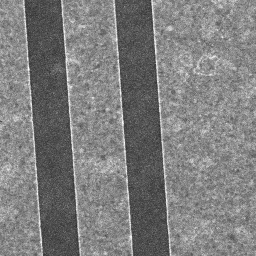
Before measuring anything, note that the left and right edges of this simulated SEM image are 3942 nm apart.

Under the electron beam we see one or a few lines or trenches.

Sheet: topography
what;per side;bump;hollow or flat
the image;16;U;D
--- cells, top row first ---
UUDDUUUDDDUUUUUU
UUDDUUUDDDUUUUUU
UUDDUUUDDDUUUUUU
UUDDUUUDDDUUUUUU
UUDDUUUDDDUUUUUU
UUDDUUUUDDUUUUUU
UUDDUUUUDDUUUUUU
UUDDUUUUDDUUUUUU
UUDDUUUUDDUUUUUU
UUDDDUUUDDUUUUUU
UUDDDUUUDDUUUUUU
UUDDDUUUDDUUUUUU
UUDDDUUUDDUUUUUU
UUDDDUUUDDUUUUUU
UUUDDUUUDDDUUUUU
UUUDDUUUDDDUUUUU